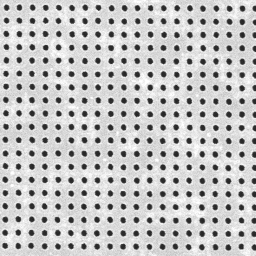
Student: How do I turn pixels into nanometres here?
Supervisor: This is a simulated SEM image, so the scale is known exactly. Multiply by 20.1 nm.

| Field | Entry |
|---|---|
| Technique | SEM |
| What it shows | a regular array of holes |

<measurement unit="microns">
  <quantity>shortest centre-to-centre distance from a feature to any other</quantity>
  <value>0.258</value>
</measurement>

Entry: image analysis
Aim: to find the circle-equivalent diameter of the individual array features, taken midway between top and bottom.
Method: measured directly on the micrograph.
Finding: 0.124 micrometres